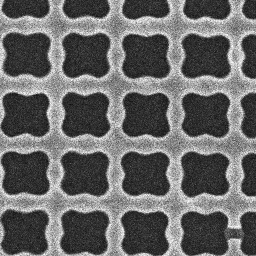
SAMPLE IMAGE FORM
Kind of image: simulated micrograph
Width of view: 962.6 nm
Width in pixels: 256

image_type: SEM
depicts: a regular array of holes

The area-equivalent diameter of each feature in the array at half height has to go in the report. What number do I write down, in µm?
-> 0.184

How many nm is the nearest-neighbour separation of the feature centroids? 221